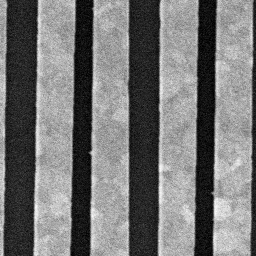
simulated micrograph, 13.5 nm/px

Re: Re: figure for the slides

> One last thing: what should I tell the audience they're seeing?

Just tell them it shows lines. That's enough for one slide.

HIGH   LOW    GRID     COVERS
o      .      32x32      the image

o....oooo...oooo....ooooo..ooooo
o....oooo...oooo....ooooo..ooooo
o....oooo...oooo....ooooo..ooooo
o....oooo...oooo....ooooo..ooooo
o....oooo...oooo....ooooo..ooooo
o....oooo...oooo....ooooo..ooooo
o....oooo...oooo....ooooo..ooooo
o....oooo...oooo....ooooo..ooooo
o....oooo...oooo....ooooo..oooo.
o....oooo...oooo....ooooo..oooo.
o....oooo...oooo....ooooo..oooo.
o....oooo...oooo....ooooo..oooo.
o....oooo...oooo....ooooo..oooo.
o....oooo...oooo....ooooo..oooo.
o....oooo...oooo....ooooo..oooo.
o....oooo...oooo....oooo...oooo.
o....oooo...oooo....oooo...oooo.
o....oooo...oooo....oooo...oooo.
o....oooo...oooo....oooo...oooo.
o....oooo...oooo....oooo...oooo.
o....oooo...oooo....oooo...oooo.
o....oooo..ooooo....oooo...oooo.
....ooooo..ooooo....oooo...oooo.
....ooooo..ooooo....oooo...oooo.
....ooooo..ooooo....oooo...oooo.
....ooooo..ooooo....oooo...oooo.
....ooooo..ooooo....oooo...oooo.
....ooooo..ooooo....oooo...oooo.
....ooooo..ooooo....oooo...oooo.
....ooooo..ooooo....oooo...oooo.
....ooooo..ooooo....oooo...oooo.
....ooooo..ooooo....oooo...oooo.